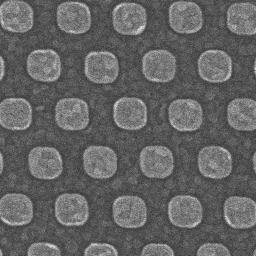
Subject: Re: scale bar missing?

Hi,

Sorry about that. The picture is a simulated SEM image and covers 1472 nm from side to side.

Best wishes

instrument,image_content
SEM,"a regular array of raised bodies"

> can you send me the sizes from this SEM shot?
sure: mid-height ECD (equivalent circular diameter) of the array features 195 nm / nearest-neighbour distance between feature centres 55.1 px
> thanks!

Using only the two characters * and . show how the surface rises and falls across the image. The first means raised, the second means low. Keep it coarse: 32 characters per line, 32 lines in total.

***.....**............**.....**.
****...****...****...****....***
****...****...****...****....***
.***....***...****....***....***
................................
................................
....***.....*......**.....**....
...****....***....****...****...
...*****...****...****...****...
....***....****...****...****...
................................
................................
.**.....**.....**.....**.....***
****...****...****...****...****
****...****...****...****...****
****...****....***...****....***
................................
................................
....**.....***....***.....**....
....***...****....****...****...
....****..*****...****...****...
....****...***....***....****...
................................
................................
.**.....**............*.........
****...****...****...****...****
****...****...****...****...****
****...****...****...****...****
................................
................................
....**....................*.....
...****....****...****...****...